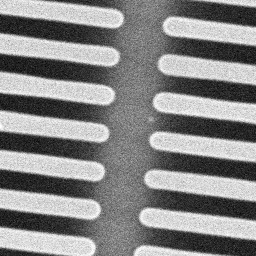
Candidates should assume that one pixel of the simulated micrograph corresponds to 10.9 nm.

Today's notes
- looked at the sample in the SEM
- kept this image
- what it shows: groups of lines, slits or small figures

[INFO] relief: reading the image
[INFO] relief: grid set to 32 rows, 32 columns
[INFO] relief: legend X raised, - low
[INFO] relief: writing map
XXXXXXXXX--------------------XXX
XXXXXXXXXXXXXXX-----------------
-------XXXXXXXX------XXX--------
--------------------XXXXXXXXXXXX
XX---------------------XXXXXXXXX
XXXXXXXXX----------------------X
XXXXXXXXXXXXXXX-----------------
--------XXXXXXX-----XXXXXX------
--------------------XXXXXXXXXXXX
XXX-------------------XXXXXXXXXX
XXXXXXXXXXX--------------------X
XXXXXXXXXXXXXX------------------
--------XXXXXX-----XXXXXXXX-----
--------------------XXXXXXXXXXXX
XXXX---------------------XXXXXXX
XXXXXXXXXXXX--------------------
-XXXXXXXXXXXX-------------------
----------XXX------XXXXXXXXX----
-------------------XXXXXXXXXXXXX
XXXXXX--------------------XXXXXX
XXXXXXXXXXXX--------------------
---XXXXXXXXXX------XX-----------
------------------XXXXXXXXXXXX--
--------------------XXXXXXXXXXXX
XXXXXXX--------------------XXXXX
XXXXXXXXXXXX--------------------
----XXXXXXXX------XXXXX---------
------------------XXXXXXXXXXXXX-
X--------------------XXXXXXXXXXX
XXXXXXXXX-------------------XXXX
XXXXXXXXXXXX--------------------
-----XXXXXXX-----XXXXXXX--------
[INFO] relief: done